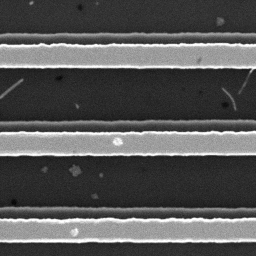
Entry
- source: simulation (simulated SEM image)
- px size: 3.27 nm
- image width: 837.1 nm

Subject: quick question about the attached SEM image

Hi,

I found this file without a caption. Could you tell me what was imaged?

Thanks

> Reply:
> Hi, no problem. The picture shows lines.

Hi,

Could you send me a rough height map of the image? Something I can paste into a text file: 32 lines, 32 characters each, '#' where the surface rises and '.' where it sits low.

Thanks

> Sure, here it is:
................................
................................
................................
................................
................................
.....#.#......#.......########..
################################
################################
.....#...........##...######.###
................................
................................
................................
................................
................................
................................
................................
..###...#.......#.#####.#.######
################################
################################
................................
................................
................................
................................
................................
................................
................................
................................
#######.########################
################################
################################
................................
................................